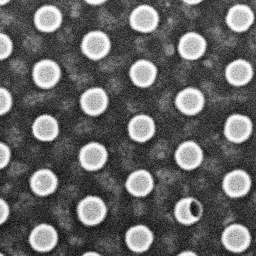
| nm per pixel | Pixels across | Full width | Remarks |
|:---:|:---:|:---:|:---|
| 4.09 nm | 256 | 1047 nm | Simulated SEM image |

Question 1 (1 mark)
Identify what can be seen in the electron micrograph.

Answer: a regular array of raised bodies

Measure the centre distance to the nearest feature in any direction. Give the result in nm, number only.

222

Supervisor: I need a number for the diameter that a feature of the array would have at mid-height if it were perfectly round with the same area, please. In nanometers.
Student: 107